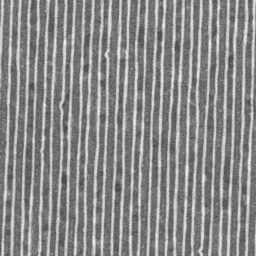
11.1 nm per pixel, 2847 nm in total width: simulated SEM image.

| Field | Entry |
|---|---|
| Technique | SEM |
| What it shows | parallel lines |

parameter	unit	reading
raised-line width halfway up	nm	94.5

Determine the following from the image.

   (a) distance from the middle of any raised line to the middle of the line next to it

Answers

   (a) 201 nm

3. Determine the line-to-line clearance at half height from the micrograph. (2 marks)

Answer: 104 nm